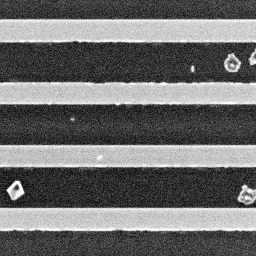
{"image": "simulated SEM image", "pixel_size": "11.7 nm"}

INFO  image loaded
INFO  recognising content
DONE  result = lines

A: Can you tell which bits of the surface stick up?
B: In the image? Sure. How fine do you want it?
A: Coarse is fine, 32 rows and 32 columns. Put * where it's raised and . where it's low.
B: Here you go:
................................
................................
................................
********************************
********************************
................................
................................
................................
................................
................................
************.********.**********
********************************
********************************
................................
................................
................................
................................
................................
********************************
********************************
********************************
................................
................................
.**.............................
.*............................**
................................
********************************
********************************
********************************
................................
................................
................................